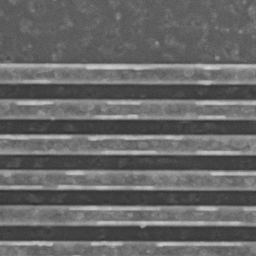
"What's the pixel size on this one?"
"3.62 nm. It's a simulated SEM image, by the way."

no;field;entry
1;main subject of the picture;parallel lines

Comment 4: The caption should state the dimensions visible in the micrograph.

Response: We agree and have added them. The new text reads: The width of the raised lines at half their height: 69.6 nanometers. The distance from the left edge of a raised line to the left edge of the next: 128 nm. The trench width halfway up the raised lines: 57.9 nanometers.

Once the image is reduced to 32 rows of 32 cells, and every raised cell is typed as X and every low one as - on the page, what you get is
--------------------------------
--------------------------------
--------------------------------
--------------------------------
--------------------------------
--------------------------------
--------------------------------
--------------------------------
XXXXXXXXXXXXXXXXXXXXXXXXXXXXXXXX
XXXXXXXXXXXXXXXXXXXXXXXXXXXXXXXX
------------------------XXX-----
--------------------------------
--------------------------------
XXXXXXXXXXXXXXXXXXXXXXXXXXXXXXXX
XXXXXXXXXXXXXXXXXXXXXXXXXXXXXXXX
--------------------------------
--------------------------------
XXXXXXXXXXXXXXXXXXXXXXXXXXXXXXXX
XXXXXXXXXXXXXXXXXXXXXXXXXXXXXXXX
--------------------------------
--------------------------------
XXXXXXXXXXXXXXXXXXXXXXXXXXXXXXXX
XXXXXXXXXXXXXXXXXXXXXXXXXXXXXXXX
XXXXXXXXXXXXXXXXXXXXXXXXXXXXXXXX
--------------------------------
--------------------------------
XXXXXXXXXXXXXXXXXXXXXXXXXXXXXXXX
XXXXXXXXXXXXXXXXXXXXXXXXXXXXXXXX
--------------------------------
--------------------------------
XXXXXXXXXXXXXXXXXXXXXXXXXXXXXXXX
XXXXXXXXXXXXXXXXXXXXXXXXXXXXXXXX